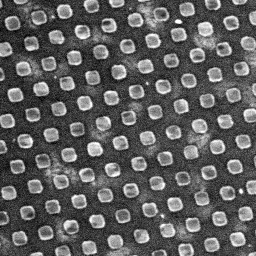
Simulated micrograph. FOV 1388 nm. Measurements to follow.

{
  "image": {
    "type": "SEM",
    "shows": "a regular array of raised bodies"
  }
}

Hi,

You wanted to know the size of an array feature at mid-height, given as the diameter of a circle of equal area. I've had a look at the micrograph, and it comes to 0.0759 um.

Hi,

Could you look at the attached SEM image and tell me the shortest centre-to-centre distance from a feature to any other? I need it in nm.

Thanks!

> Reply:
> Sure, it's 143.